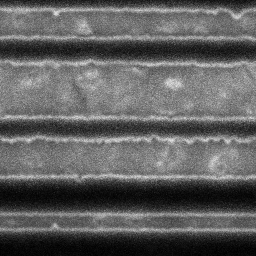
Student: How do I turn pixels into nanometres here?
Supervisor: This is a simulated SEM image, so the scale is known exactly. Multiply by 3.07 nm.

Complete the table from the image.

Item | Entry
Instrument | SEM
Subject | one or a few lines or trenches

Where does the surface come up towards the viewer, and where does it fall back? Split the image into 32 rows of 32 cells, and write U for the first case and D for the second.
UUUUUUUUUUUUUUUUUUUUUUUUUUUUUUUU
DDDDDDDUDDDDDDDDDDDDDDDDDDUDDUUD
DDDDDDDDDDDDDDDDDDDDDDDDDDDDDDDD
DDDDDDDDDDDDDDDDDDDDDDDDDDDDDDDD
DUDDDDDDDDDDDDDDDDDDDDDDDDDDDDDD
UUUUUUUUUUUUUUUUUUUUUUUUUUUUUUUU
UUUUUUUUUUUUUUUUUUUUUUUUUUUUUUUU
UUUUUUUUUUUUUUUUUUUUUUUUUUUUUUUU
DDDDDDDDDDDDDDDDDDDDDDDDDDDDDDDD
DDDDDDDDDDDDDDDDDDDDDDDDDDDDDDDD
DDDDDDDDDDDDDDDDDDDDDDDDDDDDDDDD
DDDDDDDDDDDDDDDDDDDDDDDDDDDDDDDD
DDDDDDDDDDDDDDDDDDDDDDDDDDDDDDDD
DDDDDDDDDDDDDDDDDDDDDDDDDDDDDDDD
DDUDDDDDDDDDDDDDDDDDDDDDDDDDDDDD
UUUUUUUUUUUUUUUUUUUUUUUUUUUUUUUU
UUUUUUUUUUUUUUUUUUUUUUUUUUUUUUUU
UUDUDDDUUUUUUUUUUUUDUUUUDUDDUUUD
DDDDDDDDDDDDDDDDDDDDDDDDDDDDDDDD
DDDDDDDDDDDDDDDDDDDDDDDDDDDDDDDD
DDDDDDDDDDDDDDDDDDDDDDDDDDDDDDDD
DDDDDDDDDDDDDDDDDDDDDDDDDDDDDDDD
UUUUUUUUUUUUUUUUUUUUUUUUUUUUUUUU
UUUUUUUUUUUUUUUUUUUUUUUUUUUUUUUU
UUUUUUUUUUUUUUUUUUUUUUUUUUUUUUUU
UUUUUUUUUUUUUUUUUUUUUUUUUUUUUUUU
UUUUUUUUUUUUUUUUUUUUUUUUUUUUUUUU
DDDDDDDDDDDDDDDDDDDDDDDDDDDDDDDD
DDDDDDUUDDDDDDDDDDDDDDDDDDDDDDDD
UUUUUUUUUUUUUUUUUUUUUUUUUUUUUUUU
UUUUUUUUUUUUUUUUUUUUUUUUUUUUUUUU
UUUUUUUUUUUUUUUUUUUUUUUUUUUUUUUU